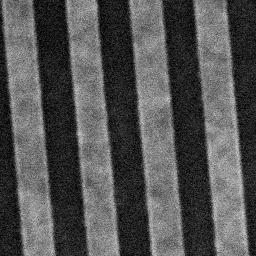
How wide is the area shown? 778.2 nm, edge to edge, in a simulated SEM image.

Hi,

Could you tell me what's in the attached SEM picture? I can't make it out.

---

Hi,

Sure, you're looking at one or a few lines or trenches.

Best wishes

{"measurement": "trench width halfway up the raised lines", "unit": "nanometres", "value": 106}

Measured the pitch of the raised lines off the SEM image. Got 195 nm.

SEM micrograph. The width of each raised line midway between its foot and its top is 89.3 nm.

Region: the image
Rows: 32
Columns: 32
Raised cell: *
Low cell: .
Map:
****....****....****....****....
.***....****....****....****....
.***.....***.....***.....***....
.***.....***.....***.....***....
.***.....***.....****....***....
.***.....***.....****....****...
.***.....***.....****....****...
.****....****....****....****...
.****....****....****....****...
.****....****....****....****...
.****....****....****....****...
.****....****....****....****...
.****....****....****....****...
.****.....***....****.....***...
..***.....***.....***.....***...
..***.....***.....****....***...
..***.....***.....****....****..
..***.....***.....****....****..
..****....****....****....****..
..****....****....****....****..
..****....****....****....****..
..****....****....****....****..
..****....****....****....****..
..****....****....****....****..
..****.....***....****.....***..
...***.....***.....***.....***..
...***.....***.....***.....***..
...***.....***.....****....****.
...***.....***.....****....****.
...****....***.....****....****.
...****....****....****....****.
...****....****....****....****.